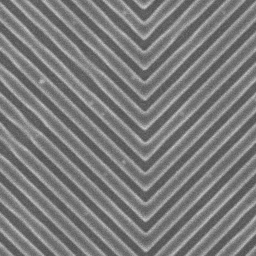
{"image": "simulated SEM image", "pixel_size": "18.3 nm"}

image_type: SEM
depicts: groups of lines, slits or small figures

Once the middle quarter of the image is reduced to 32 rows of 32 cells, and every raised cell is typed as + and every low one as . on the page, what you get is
....+++....+++++...++...+++++...
+....++++...+++++......+++++...+
++....++++...+++++....+++++...++
+++....++++...+++++..+++++...+++
++++....++++...++++++++++...++++
.++++....++++...++++++++...++++.
..++++....++++...++++++...++++..
...++++....++++...++++...++++...
+...++++....++++...++...++++....
++...++++....++++......++++....+
+++...++++....++++....++++....++
++++...++++....++++..++++....+++
+++++...+++++...++++++++....++++
.+++++...+++++...++++++....++++.
..+++++...+++++...++++....++++..
...+++++...+++++...++....++++...
+....++++...+++++.......++++...+
++....++++...+++++.....++++...++
+++....++++...+++++...++++...+++
++++....++++...+++++.++++...++++
.++++....++++...++++++++...+++++
..++++....++++...++++++...+++++.
...+++++...++++...++++...+++++..
+...+++++...++++...++...+++++...
++...+++++...++++......+++++...+
+++...+++++...++++....+++++...++
++++...+++++...++++..+++++...+++
+++++...+++++...+++++++++...++++
.+++++...+++++...+++++++...++++.
..+++++...+++++...+++++...++++..
...+++++...+++++...+++...++++...
+...+++++...+++++...+...++++...+